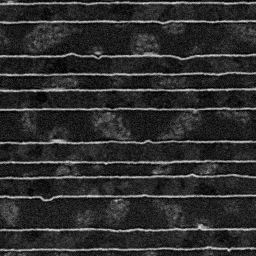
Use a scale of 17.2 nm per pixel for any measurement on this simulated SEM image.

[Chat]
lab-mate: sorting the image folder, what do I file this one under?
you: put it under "parallel lines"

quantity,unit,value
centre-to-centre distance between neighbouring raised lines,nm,781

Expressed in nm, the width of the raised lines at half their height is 329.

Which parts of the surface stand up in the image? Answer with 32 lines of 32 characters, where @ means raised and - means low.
--@-@@@@@@@-@@@@@@@@@@@@@@@@@@@@
@@@@@@@@@@@@@@@@@@@@@@@@@@@@@@@@
@@@@@@@@@@@@@@@@@@@@@@@@@@@@@@@@
--------------------------------
--------------------------------
--------------------------------
--------------------------------
@@@@@@@@@@@@@@@@@@@@@@@@@@@@@@@@
@@@@@@@@@@@@@@@@@@@@@@@@@@@@@@@@
--------------------------------
--------------------------------
@@@@@@@@@@@@@@@@@@@@@@@@@@@@@@@@
@@@@@@@@@@@@@@@@@@@@@@@@@@@@@@@@
@@@@@@@@@@@@@@@@@@@@@@@@@@@@@@@@
--------------------------------
--------------------------------
--------------------------------
--------------------------------
@@@@@@@@@@@@@@@@@@@@@@@@@@@@@@@@
@@@@@@@@@@@@@@@@@@@@@@@@@@@@@@@@
--------------------------------
--------------------------------
@@@@@@@@@@@@@@@@@@@@@@@@@@@@@@@@
@@@@@@@@@@@@@@@@@@@@@@@@@@@@@@@@
@@@@@@@@@@@@@@@@@-@-@@@@--@@@---
--------------------------------
--------------------------------
--------------------------------
--------------------------------
@@@@@@@@@@@@@@@@@@@@@@@@@@@@@@@@
@@@@@@@@@@@@@@@@@@@@@@@@@@@@@@@@
--------------------------------